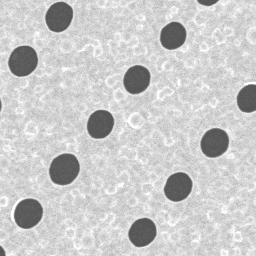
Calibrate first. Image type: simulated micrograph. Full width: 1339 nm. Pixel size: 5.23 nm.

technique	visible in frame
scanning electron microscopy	a regular array of holes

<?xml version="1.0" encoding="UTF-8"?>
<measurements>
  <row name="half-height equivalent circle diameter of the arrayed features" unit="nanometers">149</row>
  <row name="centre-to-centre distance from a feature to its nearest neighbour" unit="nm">300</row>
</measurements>